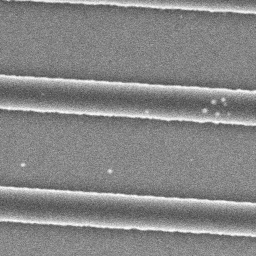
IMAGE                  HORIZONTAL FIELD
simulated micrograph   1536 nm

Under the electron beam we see lines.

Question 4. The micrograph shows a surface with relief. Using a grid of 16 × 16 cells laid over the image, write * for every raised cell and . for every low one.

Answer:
..........******
................
................
................
................
*************...
****************
..........******
................
................
................
................
*************...
****************
............****
................